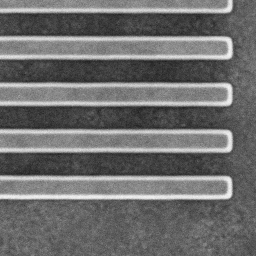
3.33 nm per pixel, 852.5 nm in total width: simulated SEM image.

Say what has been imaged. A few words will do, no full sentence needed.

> groups of lines, slits or small figures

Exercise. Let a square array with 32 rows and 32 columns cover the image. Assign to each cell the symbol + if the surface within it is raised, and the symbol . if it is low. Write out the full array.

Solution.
+++++++++++++++++++++++++++++...
................................
................................
................................
................................
+++++++++++++++++++++++++++++...
+++++++++++++++++++++++++++++...
................................
................................
................................
................................
+++++++++++++++++++++++++++++...
+++++++++++++++++++++++++++++...
................................
................................
................................
++++++++++++++++++++++++++++....
+++++++++++++++++++++++++++++...
+++++++++++++++++++++++++++++...
................................
................................
................................
+++++++++++++++++++++++++++++...
+++++++++++++++++++++++++++++...
+++++++++++++++++++++++++++++...
................................
................................
................................
................................
................................
................................
................................